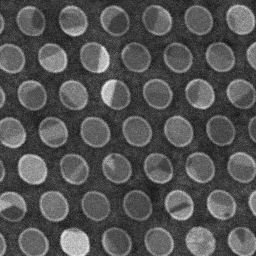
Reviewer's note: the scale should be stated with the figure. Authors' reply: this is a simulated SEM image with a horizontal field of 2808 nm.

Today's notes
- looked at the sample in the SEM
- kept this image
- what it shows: a regular array of raised bodies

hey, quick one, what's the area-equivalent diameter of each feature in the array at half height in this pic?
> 306 nm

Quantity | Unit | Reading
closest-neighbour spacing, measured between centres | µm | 0.457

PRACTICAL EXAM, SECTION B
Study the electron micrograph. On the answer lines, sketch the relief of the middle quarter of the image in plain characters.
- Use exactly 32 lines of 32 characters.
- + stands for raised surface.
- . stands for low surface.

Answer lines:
.....++++++.....+++++.....+++++.
......++++.......+++.......+++..
................................
................................
.++........+++.......++++.......
+++++.....++++++....++++++.....+
+++++.....++++++....+++++++....+
++++++....++++++....+++++++....+
++++++....++++++....+++++++....+
++++++....++++++.....+++++.....+
+++++......++++.......++++......
................................
................................
.................++........++...
.....+++++.....+++++......+++++.
.....++++++....++++++....+++++++
+....++++++....+++++++...+++++++
+....++++++....+++++++...+++++++
+....++++++.....++++++....++++++
......+++++.....+++++......++++.
.......++.......................
................................
................................
++++.......++++......+++++.....+
+++++.....++++++....++++++.....+
++++++....++++++....+++++++....+
++++++....+++++++...+++++++....+
++++++....+++++++....++++++....+
++++++.....+++++......+++++.....
..++.........+.........++.......
................................
................................